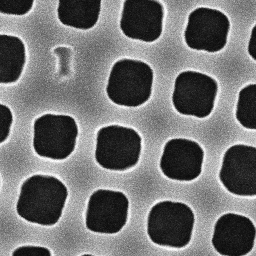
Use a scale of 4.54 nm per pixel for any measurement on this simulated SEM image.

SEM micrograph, a regular array of holes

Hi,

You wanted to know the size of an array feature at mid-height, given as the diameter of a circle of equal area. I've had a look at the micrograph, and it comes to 212 nanometers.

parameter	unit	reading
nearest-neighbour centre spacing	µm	0.295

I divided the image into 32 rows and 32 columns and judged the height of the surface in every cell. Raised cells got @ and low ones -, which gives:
----@@@------@@-----@@@@@@@@@@@@
---@@@@-----@@@-----@@@@----@@@@
@@@@@@@-----@@@-----@@@------@@@
@@@@@@@@@--@@@@-----@@@------@@@
--@@@@@@@@@@@@@@----@@@-----@@@-
---@@@@@@@@@@@@@@@@@@@@-----@@@-
---@@@@@@@@@@@@@@@@@@@@@@@@@@@@-
---@@@@@@@@@@@@--@@@@@@@@@@@@@@@
---@@@@@@@@@@@-----@@@@@@@@@@@@@
---@@@@@@@@@@@-----@@@----@@@@@@
@@@@@@@@@@@@@------@@@-----@@@@-
@@@@@@@@@@@@@------@@@-----@@@--
@@@@@@@@@@@@@@----@@@@-----@@@--
-@@@@@@@@@@@@@@@@@@@@@-----@@@--
--@@@----@@@@@@@@@@@@@@@--@@@@--
-@@@-----@@@@@@@@@@@@@@@@@@@@@--
-@@@------@@-----@@@@@@@@@@@@@@@
-@@@------@@------@@@---@@@@@@@@
@@@@-----@@@------@@@----@@@@---
@@@@@----@@@-----@@@-----@@@----
@@@@@@@@@@@@-----@@@-----@@@----
@@@@@@@@@@@@@@@@@@@@-----@@-----
@@@----@@@@@@@@@@@@@@@@-@@@@----
@@@-----@@@@@@@@@@@@@@@@@@@@----
@@------@@@-----@@@@@@@@@@@@@@-@
@@------@@@-----@@@@---@@@@@@@@@
@@------@@@-----@@@-----@@@@@@@@
@@@----@@@@-----@@------@@@----@
@@@@@@@@@@@----@@@------@@@-----
@@@@@@@@@@@@@@@@@@@-----@@@-----
@@@@@@@@@@@@@@@@@@@@---@@@@-----
@@----@@@@@@@@@@@@@@@@@@@@@----@